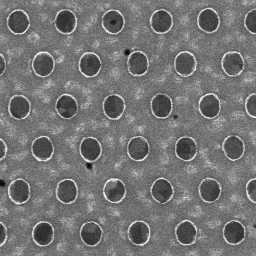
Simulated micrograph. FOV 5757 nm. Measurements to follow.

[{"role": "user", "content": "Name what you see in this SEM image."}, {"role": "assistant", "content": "a regular array of raised bodies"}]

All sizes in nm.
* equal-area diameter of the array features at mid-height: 509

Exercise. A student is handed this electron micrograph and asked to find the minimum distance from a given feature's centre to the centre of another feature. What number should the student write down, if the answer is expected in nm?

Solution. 1070